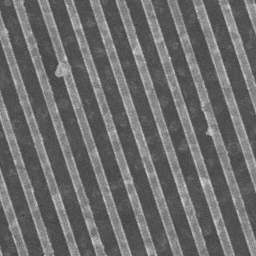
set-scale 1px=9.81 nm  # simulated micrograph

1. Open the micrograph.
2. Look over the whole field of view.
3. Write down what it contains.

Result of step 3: parallel lines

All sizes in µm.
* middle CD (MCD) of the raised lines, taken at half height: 0.0793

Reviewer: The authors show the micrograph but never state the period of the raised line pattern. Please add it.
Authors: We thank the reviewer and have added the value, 240 nm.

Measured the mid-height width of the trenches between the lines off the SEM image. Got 157 nm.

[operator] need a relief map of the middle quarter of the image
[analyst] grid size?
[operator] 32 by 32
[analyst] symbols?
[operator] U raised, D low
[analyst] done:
UDDDDDUUDDDDUUDDDDUUUDDDDUUDDDDU
UUDDDDUUDDDDUUDDDDDUUDDDDUUDDDDD
UUDDDDUUDDDDDUUDDDDUUDDDDUUUDDDD
UUDDDDDUUDDDDUUDDDDUUUDDDDUUDDDD
UUDDDDDUUDDDDUUDDDDDUUDDDDUUDDDD
DUUDDDDUUDDDDDUUDDDDUUDDDDUUUDDD
DUUDDDDDUUDDDDUUDDDDUUUDDDDUUDDD
DUUDDDDDUUDDDDUUDDDDDUUDDDDUUDDD
DDUUDDDDUUDDDDDUUDDDDUUDDDDUUUDD
DDUUDDDDDUUDDDDUUDDDDUUUDDDDUUDD
DDUUUDDDDUUDDDDUUDDDDDUUDDDDUUDD
DDDUUDDDDUUDDDDDUUDDDDUUDDDDUUUD
DDDUUDDDDDUUDDDDUUDDDDUUUDDDDUUD
DDDUUDDDDDUUDDDDUUDDDDDUUDDDDUUD
DDDDUUDDDDUUDDDDDUUDDDDUUDDDDUUU
DDDDUUDDDDDUUDDDDUUDDDDUUUDDDDUU
DDDDUUDDDDDUUDDDDUUDDDDDUUDDDDUU
DDDDDUUDDDDUUDDDDDUUDDDDUUDDDDUU
UDDDDUUDDDDDUUDDDDUUDDDDUUUDDDDU
UDDDDUUDDDDDUUDDDDUUDDDDDUUDDDDU
UDDDDDUUDDDDUUDDDDDUUDDDDUUDDDDU
UUDDDDUUDDDDDUUDDDDUUDDDDUUUDDDD
UUDDDDUUDDDDDUUDDDDUUDDDDDUUDDDD
UUDDDDDUUDDDDUUDDDDDUUDDDDUUDDDD
DUUDDDDUUDDDDDUUDDDDUUDDDDUUDDDD
DUUDDDDUUDDDDDUUDDDDUUDDDDDUUDDD
DUUDDDDDUUDDDDUUDDDDUUUDDDDUUDDD
DDUUDDDDUUDDDDUUUDDDDUUDDDDUUDDD
DDUUDDDDUUDDDDDUUDDDDUUDDDDDUUDD
DDUUDDDDDUUDDDDUUDDDDUUUDDDDUUDD
DDDUUDDDDUUDDDDUUUDDDDUUDDDDUUDD
DDDUUDDDDUUDDDDDUUDDDDUUDDDDDUUD